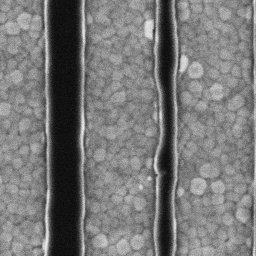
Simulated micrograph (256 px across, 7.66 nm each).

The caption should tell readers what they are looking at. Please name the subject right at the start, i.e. one or a few lines or trenches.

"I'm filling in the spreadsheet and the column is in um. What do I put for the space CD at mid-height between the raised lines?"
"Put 0.591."